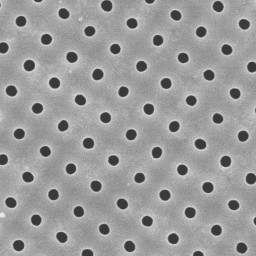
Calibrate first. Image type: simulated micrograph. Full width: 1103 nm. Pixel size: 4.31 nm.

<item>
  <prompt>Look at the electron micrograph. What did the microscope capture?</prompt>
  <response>a regular array of holes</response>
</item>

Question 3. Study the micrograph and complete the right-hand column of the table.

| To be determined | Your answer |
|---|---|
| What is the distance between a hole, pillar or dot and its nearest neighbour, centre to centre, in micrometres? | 0.132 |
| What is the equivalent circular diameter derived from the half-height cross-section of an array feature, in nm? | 47.9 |